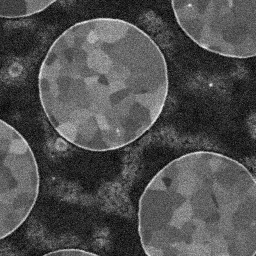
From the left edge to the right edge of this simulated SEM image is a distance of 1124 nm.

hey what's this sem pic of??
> raised bodies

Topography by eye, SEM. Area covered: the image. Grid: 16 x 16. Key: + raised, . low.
+++........+++++
.....+++...+++++
....+++++...++++
...+++++++....++
...+++++++......
..++++++++......
...+++++++......
...+++++++......
+...+++++.......
++..............
++........+++++.
++.......+++++++
++.......+++++++
++.......+++++++
+........+++++++
.........+++++++